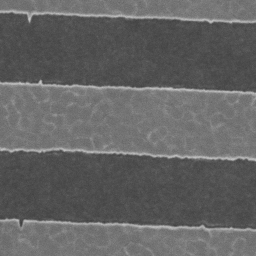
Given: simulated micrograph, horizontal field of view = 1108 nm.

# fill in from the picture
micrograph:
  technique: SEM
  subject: one or a few lines or trenches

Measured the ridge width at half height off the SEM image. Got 67.7 px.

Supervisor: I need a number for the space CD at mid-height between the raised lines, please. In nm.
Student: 301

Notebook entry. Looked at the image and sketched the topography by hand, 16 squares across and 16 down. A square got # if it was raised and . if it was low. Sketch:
################
................
................
................
................
########.#......
################
################
################
.....###########
................
................
................
................
################
################